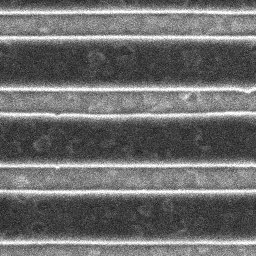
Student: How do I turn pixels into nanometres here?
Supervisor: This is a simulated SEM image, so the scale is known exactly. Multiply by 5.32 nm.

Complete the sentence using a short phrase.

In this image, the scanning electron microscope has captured one or a few lines or trenches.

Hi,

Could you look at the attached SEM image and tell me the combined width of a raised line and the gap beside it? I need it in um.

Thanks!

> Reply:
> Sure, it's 0.408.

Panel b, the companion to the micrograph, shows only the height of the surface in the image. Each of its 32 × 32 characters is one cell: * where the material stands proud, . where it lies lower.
********************************
*********.................******
................................
................................
................................
********************************
********************************
********************************
********************************
********************************
********************************
................................
................................
................................
************.*******************
********************************
********************************
********************************
********************************
********************************
********************************
................................
................................
................................
********************************
********************************
********************************
********************************
********************************
********************************
................................
................................